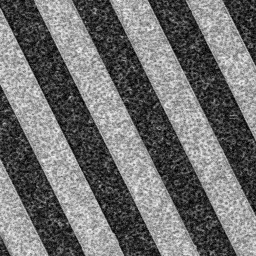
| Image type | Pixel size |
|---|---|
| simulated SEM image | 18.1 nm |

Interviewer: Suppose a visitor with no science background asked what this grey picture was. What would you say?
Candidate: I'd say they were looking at one or a few lines or trenches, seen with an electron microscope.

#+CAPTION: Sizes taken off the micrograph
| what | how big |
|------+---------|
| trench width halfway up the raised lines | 625 nanometres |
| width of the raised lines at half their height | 33.1 px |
